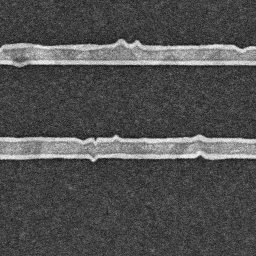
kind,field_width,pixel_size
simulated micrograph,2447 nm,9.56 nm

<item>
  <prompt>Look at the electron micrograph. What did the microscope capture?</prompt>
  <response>one or a few lines or trenches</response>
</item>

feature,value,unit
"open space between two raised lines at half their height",739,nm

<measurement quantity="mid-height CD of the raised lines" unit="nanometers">152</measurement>